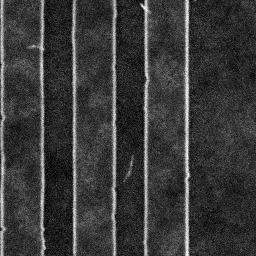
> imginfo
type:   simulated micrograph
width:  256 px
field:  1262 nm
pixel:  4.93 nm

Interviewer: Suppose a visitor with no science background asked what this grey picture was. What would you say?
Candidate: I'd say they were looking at one or a few lines or trenches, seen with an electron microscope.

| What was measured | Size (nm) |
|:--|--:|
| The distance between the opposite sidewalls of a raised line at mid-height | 203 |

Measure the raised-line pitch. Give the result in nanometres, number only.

355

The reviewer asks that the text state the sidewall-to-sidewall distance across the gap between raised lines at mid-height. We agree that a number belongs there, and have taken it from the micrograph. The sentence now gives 30.9 pixels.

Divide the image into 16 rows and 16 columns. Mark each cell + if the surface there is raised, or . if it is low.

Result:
+++..++..+++....
+++..++..+++....
+++..++..+++....
+++..++..+++....
+++..++..+++....
+++..++..+++....
+++..++..+++....
+++..++..+++....
+++..++..+++....
+++..++..+++....
+++..++..+++....
+++..++..+++....
+++..++..+++....
+++..++..+++....
+++..++..+++....
+++..++..+++....